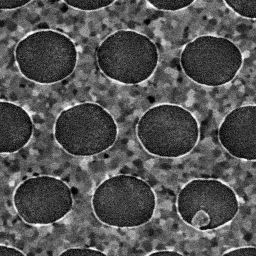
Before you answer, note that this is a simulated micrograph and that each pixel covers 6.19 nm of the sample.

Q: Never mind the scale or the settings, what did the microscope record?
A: a regular array of holes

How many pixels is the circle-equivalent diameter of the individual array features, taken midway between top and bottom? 57.2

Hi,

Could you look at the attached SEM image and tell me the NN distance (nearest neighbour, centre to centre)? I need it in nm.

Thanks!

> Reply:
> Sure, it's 505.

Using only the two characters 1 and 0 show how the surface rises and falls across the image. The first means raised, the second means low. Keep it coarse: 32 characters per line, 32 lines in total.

00011111000000111110000011110000
11111111111111111111111111111000
11111111111111111111111111111111
11111111111111111111111111111111
11100000111111000011111110111111
11000000011110000001111100000111
11000000001100000000111000000011
11000000001100000000111000000011
11000000011110000001111000000011
11100000111110000001111000000111
11111011111111111111111110001111
11111111111111111111111111111111
11111111111111111111111111111111
00011111100001111110000111111100
00001110000000111100000011110000
00001110000000111000000001110000
00001110000000011000000001100000
00001110000000111000000001100000
00011111000000111100000011110000
11111111110111111111000111111000
11111111111111111111111111111111
11111111111111111111111111111111
11100000111110000011111100011111
11000000011100000001111000000111
11000000011100000001110000000011
11000000011100000001110000000011
11000000011100000001110000000011
11100001111100000001111000000111
11111111111111111111111100011111
11111111111111111111111111111111
11111111111111111111111111111111
00011111000001111110001111110000